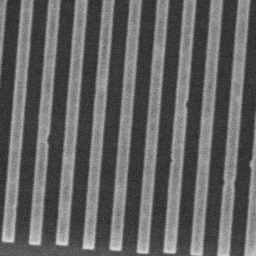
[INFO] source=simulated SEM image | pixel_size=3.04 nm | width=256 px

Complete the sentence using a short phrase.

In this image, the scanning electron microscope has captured parallel lines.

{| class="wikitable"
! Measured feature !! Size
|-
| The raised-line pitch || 0.0819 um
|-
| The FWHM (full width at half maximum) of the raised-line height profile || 32.5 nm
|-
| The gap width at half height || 47.3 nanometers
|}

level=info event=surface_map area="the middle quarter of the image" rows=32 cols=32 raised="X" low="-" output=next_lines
--XX----XXX----XXX----XXX----XX-
--XX----XXX----XXX----XXX----XX-
-XXX----XXX----XXX----XX-----XX-
-XXX----XXX----XXX----XX-----XX-
-XXX----XXX----XXX----XX----XXX-
-XXX----XXX----XXX----XX-----XX-
-XXX----XX-----XXX----XX----XXX-
-XXX----XX-----XX-----XX----XXX-
-XXX----XX-----XX----XXX----XXX-
-XXX----XX-----XX----XXX----XX--
-XXX----XX----XXX----XXX----XX--
-XX-----XX----XXX----XXX----XXX-
-XX----XXX----XXX----XXX----XX--
-XX----XXX----XXX----XXX----XX--
XXX----XXX----XXX----XX-----XX--
XXX----XXX----XXX----XX----XXX--
XXX----XXX----XX-----XX----XXX--
XXX----XXX----XX-----XX----XXX--
XXX----XX-----XX-----XX----XXX--
XXX----XX-----XX-----XX----XXX--
XXX----XX-----XX----XXX----XXX--
XXX----XX-----XX----XXX----XXX--
XXX----XX----XXX----XXX----XXX--
XX-----XX----XXX----XXX----XXX--
XX-----XX----XXX----XXX----XXX--
XX----XXX----XXX----XXX----XX---
XX----XXX----XXX----XXX----XX---
XX----XXX----XXX----XX-----XX---
XX----XXX----XXX----XX----XXX---
XX----XXX----XX-----XX----XXX---
XX----XXX----XXX----XX----XXX---
XX----XX-----XXX----XX----XXX---